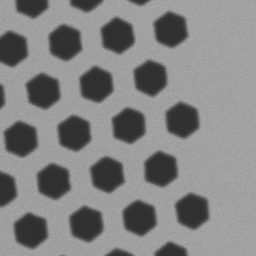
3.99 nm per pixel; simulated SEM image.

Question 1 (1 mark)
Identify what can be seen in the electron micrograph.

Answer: a regular array of holes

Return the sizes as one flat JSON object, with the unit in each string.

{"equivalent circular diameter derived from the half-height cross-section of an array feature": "131 nanometres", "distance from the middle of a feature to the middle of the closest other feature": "0.209 um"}